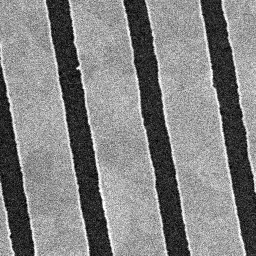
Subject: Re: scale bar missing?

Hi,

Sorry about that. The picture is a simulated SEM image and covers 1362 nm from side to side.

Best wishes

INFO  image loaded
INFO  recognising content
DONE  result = one or a few lines or trenches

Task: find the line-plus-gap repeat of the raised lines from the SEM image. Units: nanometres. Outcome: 405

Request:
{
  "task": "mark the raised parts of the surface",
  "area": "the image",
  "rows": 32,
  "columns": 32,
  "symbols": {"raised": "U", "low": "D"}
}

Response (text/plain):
UUUUUUDDDUUUUUUDDDUUUUUUUDDDUUUU
UUUUUUDDDUUUUUUUDDDUUUUUUDDDUUUU
UUUUUUDDDUUUUUUUDDDUUUUUUDDDUUUU
UUUUUUDDDUUUUUUUDDDUUUUUUUDDUUUU
UUUUUUDDDUUUUUUUDDDUUUUUUUDDDUUU
UUUUUUUDDUUUUUUUDDDUUUUUUUDDDUUU
UUUUUUUDDDUUUUUUUDDUUUUUUUDDDUUU
UUUUUUUDDDUUUUUUUDDDUUUUUUDDDUUU
UUUUUUUDDDUUUUUUUDDDUUUUUUDDDUUU
UUUUUUUDDDUUUUUUUDDDUUUUUUUDDDUU
DUUUUUUDDDUUUUUUUDDDUUUUUUUDDDUU
DUUUUUUUDDDUUUUUUDDDUUUUUUUDDDUU
DUUUUUUUDDDUUUUUUDDDUUUUUUUDDDUU
DUUUUUUUDDDUUUUUUUDDUUUUUUUDDDUU
DDUUUUUUDDDUUUUUUUDDDUUUUUUUDDUU
DDUUUUUUDDDUUUUUUUDDDUUUUUUUDDDU
DDUUUUUUDDDUUUUUUUDDDUUUUUUUDDDU
DDUUUUUUUDDDUUUUUUDDDUUUUUUUDDDU
DDUUUUUUUDDDUUUUUUUDDUUUUUUUDDDU
DDUUUUUUUDDDUUUUUUUDDDUUUUUUDDDU
DDDUUUUUUDDDUUUUUUUDDDUUUUUUDDDU
DDDUUUUUUDDDUUUUUUUDDDUUUUUUUDDD
DDDUUUUUUUDDUUUUUUUDDDUUUUUUUDDD
DDDUUUUUUUDDUUUUUUUDDDUUUUUUUDDD
DDDUUUUUUUDDDUUUUUUUDDDUUUUUUDDD
DDDUUUUUUUDDDUUUUUUUDDDUUUUUUDDD
UDDDUUUUUUDDDUUUUUUUDDDUUUUUUUDD
UDDDUUUUUUDDDUUUUUUUDDDUUUUUUUDD
UDDDUUUUUUUDDDUUUUUUDDDUUUUUUUDD
UDDDUUUUUUUDDDUUUUUUDDDUUUUUUUDD
UDDDUUUUUUUDDDUUUUUUUDDDUUUUUUDD
UUDDUUUUUUUDDDUUUUUUUDDDUUUUUUUD